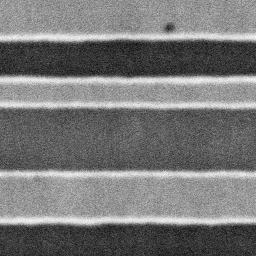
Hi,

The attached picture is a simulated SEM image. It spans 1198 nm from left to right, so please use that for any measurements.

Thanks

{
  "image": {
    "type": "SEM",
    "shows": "lines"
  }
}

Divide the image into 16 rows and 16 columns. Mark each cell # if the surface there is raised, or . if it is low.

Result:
################
################
................
................
................
################
################
................
................
................
................
################
################
################
................
................